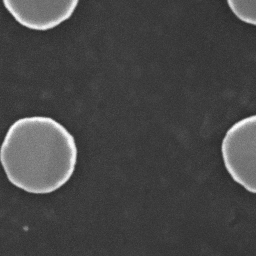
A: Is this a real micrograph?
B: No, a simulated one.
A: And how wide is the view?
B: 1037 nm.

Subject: raised bodies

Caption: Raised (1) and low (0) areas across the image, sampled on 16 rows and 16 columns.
1111100000000001
0110000000000000
0000000000000000
0000000000000000
0000000000000000
0000000000000000
0000000000000000
0110000000000001
1111000000000011
1111100000000011
1111100000000011
0111000000000001
0000000000000000
0000000000000000
0000000000000000
0000000000000000